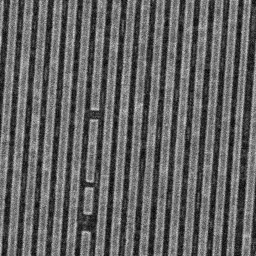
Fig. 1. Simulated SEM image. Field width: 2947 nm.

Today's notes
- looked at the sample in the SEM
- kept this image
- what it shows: parallel lines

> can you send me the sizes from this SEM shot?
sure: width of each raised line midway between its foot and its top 81.8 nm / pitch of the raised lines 167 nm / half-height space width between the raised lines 83.2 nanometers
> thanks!